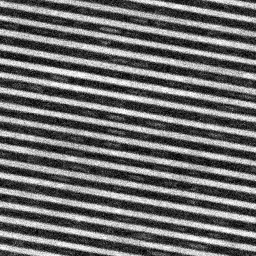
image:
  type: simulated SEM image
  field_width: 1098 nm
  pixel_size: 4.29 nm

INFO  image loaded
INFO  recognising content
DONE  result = parallel lines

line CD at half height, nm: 20.6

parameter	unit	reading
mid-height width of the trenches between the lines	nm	41.2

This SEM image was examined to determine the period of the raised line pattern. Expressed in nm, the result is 60.5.